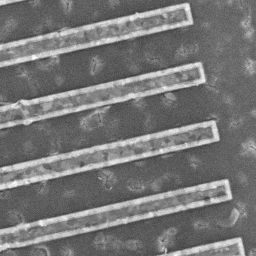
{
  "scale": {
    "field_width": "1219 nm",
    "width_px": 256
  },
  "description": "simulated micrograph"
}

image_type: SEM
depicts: parallel lines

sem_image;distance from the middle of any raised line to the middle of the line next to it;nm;285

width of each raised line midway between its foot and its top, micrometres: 0.0836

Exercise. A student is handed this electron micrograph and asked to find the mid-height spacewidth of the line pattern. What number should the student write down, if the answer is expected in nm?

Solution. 198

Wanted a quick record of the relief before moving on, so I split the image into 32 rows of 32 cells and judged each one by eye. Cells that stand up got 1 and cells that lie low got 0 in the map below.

00000000000000000000000000000000
00000000000000000001111100000000
00000000000000011111111100000000
00000000000111111111100000000000
00000011111111111000000000000000
00111111111100000000000000000000
11111111000000000000000000000000
11100000000000000000000000000000
00000000000000000000000110000000
00000000000000000011111110000000
00000000000000111111111100000000
00000000011111111110000000000000
00000111111111100000000000000000
11111111110000000000000000000000
11111100000000000000000000000000
10000000000000000000000000100000
00000000000000000000011111100000
00000000000000000111111111100000
00000000000011111111110000000000
00000000111111111100000000000000
00011111111110000000000000000000
11111111100000000000000000000000
11110000000000000000000000000000
00000000000000000000000011110000
00000000000000000000111111111000
00000000000000011111111110000000
00000000000111111111100000000000
00000011111111110000000000000000
00111111111100000000000000000000
11111111000000000000000000000000
11100000000000000000000000011100
00000000000000000000000111111100